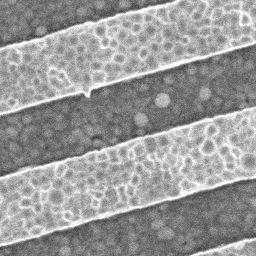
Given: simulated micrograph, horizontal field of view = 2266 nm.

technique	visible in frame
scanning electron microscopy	one or a few lines or trenches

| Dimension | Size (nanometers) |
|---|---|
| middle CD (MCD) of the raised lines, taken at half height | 579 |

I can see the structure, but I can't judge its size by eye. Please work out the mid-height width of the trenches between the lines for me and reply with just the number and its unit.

0.543 microns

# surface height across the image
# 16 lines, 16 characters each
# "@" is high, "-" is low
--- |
---------@@@@@@@
-----@@@@@@@@@@@
--@@@@@@@@@@@@@@
@@@@@@@@@@@@@---
@@@@@@@@@-------
@@@@@@----------
@@--------------
-------------@@@
---------@@@@@@@
------@@@@@@@@@@
--@@@@@@@@@@@@@@
@@@@@@@@@@@@@@--
@@@@@@@@@@------
@@@@@@@---------
@@@-------------
--------------@@